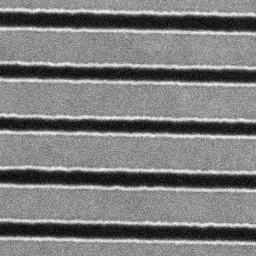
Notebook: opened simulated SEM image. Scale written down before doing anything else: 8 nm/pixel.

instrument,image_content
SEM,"lines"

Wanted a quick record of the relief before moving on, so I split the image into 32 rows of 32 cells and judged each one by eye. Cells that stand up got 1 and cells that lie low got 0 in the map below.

00000000000000000000000000000000
11111111111111110010000000000000
11111111111111111111111111111111
11111111111111111111111111111111
00000000000000000000000000000000
00000000000000000000000000000000
00000000000000000000000000000000
00000000000000000000000000000000
11111111111111111111111111111111
11111111111111111111111111111111
00000000000000000000000111111111
00000000000000000000000000000000
00000000000000000000000000000000
00000000000000000000000000000000
11111000000000000000000000000000
11111111111111111111111111111111
11111111111111111111111111111111
00000000000000000000000000000000
00000000000000000000000000000000
00000000000000000000000000000000
00000000000000000000000000000000
11111111111111111111111111111111
11111111111111111111111111111111
00000000000001111111111111111111
00000000000000000000000000000000
00000000000000000000000000000000
00000000000000000000000000000000
11000000000000000000000000000000
11111111111111111111111111111111
11111111111111111111111111111111
00000000000000000000000000000000
00000000000000000000000000000000